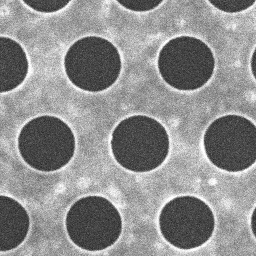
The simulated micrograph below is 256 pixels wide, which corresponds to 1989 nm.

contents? holes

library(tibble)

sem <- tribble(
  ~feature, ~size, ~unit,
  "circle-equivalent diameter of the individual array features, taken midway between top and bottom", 441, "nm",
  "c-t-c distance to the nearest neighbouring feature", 716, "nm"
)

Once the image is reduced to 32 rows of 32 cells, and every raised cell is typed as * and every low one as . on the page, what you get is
***.....*******.....******......
*****..**********.**********..**
********************************
********************************
***********.***********.********
..*******.....*******.....******
...*****.......*****.......*****
...*****.......*****.......****.
....****.......*****.......****.
...*****.......*****......******
...******.....*******.....******
.*******************************
********************************
********************************
*****..**********.**********..**
***.....*******.....******......
***......*****.......*****......
**.......*****.......****.......
**.......*****.......****.......
***......*****.......*****......
***.....*******.....*******.....
*****************.***********.**
********************************
********************************
***********..**********.********
...******.....*******.....******
...*****.......*****.......*****
....****.......*****.......****.
....****.......*****.......****.
...******......*****......******
...******.....*******....*******
.*******************************